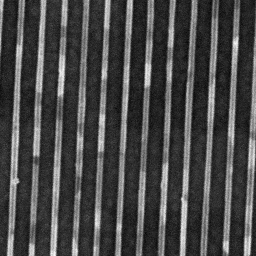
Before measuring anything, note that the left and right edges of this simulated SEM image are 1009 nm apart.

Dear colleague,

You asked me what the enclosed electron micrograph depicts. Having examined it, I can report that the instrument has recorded parallel lines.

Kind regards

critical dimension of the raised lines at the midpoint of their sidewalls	0.0187	µm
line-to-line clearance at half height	0.0678	µm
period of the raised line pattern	84.8	nm